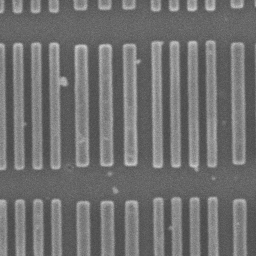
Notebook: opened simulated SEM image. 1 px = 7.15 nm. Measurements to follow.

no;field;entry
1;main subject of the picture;groups of lines, slits or small figures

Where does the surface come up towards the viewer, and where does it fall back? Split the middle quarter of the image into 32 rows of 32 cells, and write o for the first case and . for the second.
...ooo...ooo...ooo....oo...oo..o
...ooo...ooo...ooo....oo...oo..o
...ooo...ooo...ooo....oo...oo..o
...ooo...ooo...ooo....oo...oo..o
...ooo...ooo...ooo....oo...oo..o
...ooo...ooo...ooo....oo...oo..o
...ooo...ooo...ooo....oo...oo..o
...ooo...ooo...ooo....oo...oo..o
...ooo...ooo...ooo....oo...oo..o
...ooo...ooo...ooo....oo...oo..o
...ooo...ooo...ooo....oo...oo..o
...ooo...ooo...ooo....oo...oo..o
...ooo...ooo...ooo....oo...oo..o
...ooo...ooo...ooo....oo...oo..o
...ooo...ooo...ooo....oo...oo..o
...ooo...ooo...ooo....oo...oo..o
...ooo...ooo....oo....oo...oo..o
...ooo...ooo...ooo....oo...oo...
...ooo...ooo...ooo....oo...oo...
...ooo...ooo...ooo....oo...oo...
...ooo...ooo...ooo....oo...oo...
...ooo...ooo...ooo....oo...oo...
...ooo...ooo...ooo.....o...oo...
...ooo...ooo...ooo.....o...oo...
...ooo...ooo...ooo.....o...oo...
.......................o...oo...
................................
................................
................................
................................
................................
................................